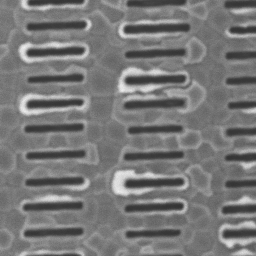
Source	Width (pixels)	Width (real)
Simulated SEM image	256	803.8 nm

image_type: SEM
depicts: a regular array of holes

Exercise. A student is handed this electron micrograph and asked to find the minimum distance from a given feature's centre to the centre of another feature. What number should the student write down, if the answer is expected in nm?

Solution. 78